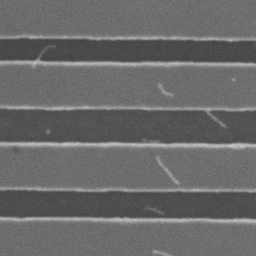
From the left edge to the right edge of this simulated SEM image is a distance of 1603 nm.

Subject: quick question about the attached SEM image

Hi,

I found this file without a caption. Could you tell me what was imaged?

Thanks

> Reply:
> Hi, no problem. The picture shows lines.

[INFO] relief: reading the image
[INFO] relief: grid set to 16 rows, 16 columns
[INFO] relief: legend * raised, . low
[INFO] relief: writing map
****************
****************
..............*.
................
****************
****************
****************
................
................
****************
****************
****************
................
................
****************
****************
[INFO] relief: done